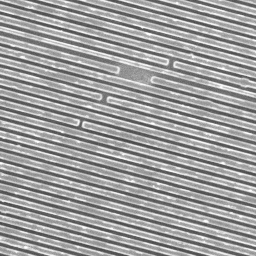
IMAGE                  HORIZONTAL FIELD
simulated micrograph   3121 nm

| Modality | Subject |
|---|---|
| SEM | parallel lines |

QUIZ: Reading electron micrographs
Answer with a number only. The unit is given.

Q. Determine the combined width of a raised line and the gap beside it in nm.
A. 124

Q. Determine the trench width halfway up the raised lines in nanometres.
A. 47.1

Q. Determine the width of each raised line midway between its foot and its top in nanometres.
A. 82.5